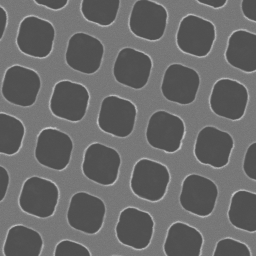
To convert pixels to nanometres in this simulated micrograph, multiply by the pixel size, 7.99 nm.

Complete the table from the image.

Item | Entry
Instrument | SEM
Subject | a regular array of holes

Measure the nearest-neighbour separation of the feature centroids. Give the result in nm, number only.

400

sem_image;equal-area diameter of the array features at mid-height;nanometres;309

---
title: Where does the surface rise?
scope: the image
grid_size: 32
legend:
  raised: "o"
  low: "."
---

ooooo...oo.....oo...oooooo..oo..
.ooooooooo.....o.....ooooooooo..
.oo..oooooo...oo.....oo...oooooo
.o.....ooooooooo.....o.....ooooo
oo.....oo..oooooo...oo.....oo...
oo.....oo....ooooooooo.....oo...
ooo...oo.....oo..oooooo...oo....
oooooooo.....oo....ooooooooo....
o..oooooo...oo.....oo...oooooo..
o....ooooooooo.....oo....ooooooo
.....oo...oooooo..oo.....oo...oo
.....oo....ooooooooo.....oo....o
o...oo.....oo...ooooo...oo.....o
oooooo.....oo....oooooooooo....o
.oooooo...oo.....oo...oooooo..oo
...ooooooooo.....oo....ooooooooo
...oo...ooooo...oo.....oo...oooo
...oo....ooooooooo.....oo....ooo
..ooo....oo...ooooo...oo.....oo.
oooo.....oo....oooooooooo....oo.
ooooo...oo.....oo...oooooo..oo..
.ooooooooo.....oo....oooooooooo.
.ooo..oooooo..oo.....oo...oooooo
.oo....oooooooooo....oo....ooooo
.oo....oo...ooooo...ooo....oo...
ooo....oo....oooooooooo....oo...
ooo....o.....oo...oooooo..ooo...
ooooooooo....oo....oooooooooo...
o..oooooo...ooo....oo...oooooo..
o....oooooooooo....oo....ooooooo
o....oo...oooooo..ooo....oo...oo
o....oo....oooooooooo....oo....o